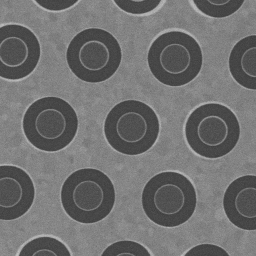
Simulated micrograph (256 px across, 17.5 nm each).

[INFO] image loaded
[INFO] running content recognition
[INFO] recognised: an array of small figures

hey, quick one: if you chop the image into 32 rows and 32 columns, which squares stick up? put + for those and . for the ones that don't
+++++....+++++......++++......++
++++++++++++++++...++++++....+++
++++++++++++++++++++++++++++++++
...++++++++.++++++++++++++++++++
....+++++.....++++++....+++++++.
.....++++......++++......++++...
.....+++.......++++......++++...
.....+++.......+++.......++++...
....+++++......++++......++++...
...+++++++....+++++......++++...
++++++++++++++++++++...+++++++..
++++++++++++++++++++++++++++++++
+++++...++++++++++++++++++++++++
+++......+++++.....+++++.....+++
+++.......+++.......++++.....+++
+++.......+++.......+++.......++
+++.......+++.......+++.......++
+++......++++.......+++.......++
+++++...++++++.....+++++.....+++
+++++++++++++++++++++++++...++++
++++++++++++++++++++++++++++++++
...++++++....+++++++..++++++++++
....++++......+++++.....+++++...
....++++......++++......++++....
....++++......++++.......+++....
....++++......++++......++++....
...+++++......++++......++++....
.++++++++....++++++....++++++...
++++++++++++++++++++++++++++++..
+++++.++++++++++++++++++++++++++
+++.....++++++....+++++++.++++++
++.......++++......++++.....++++